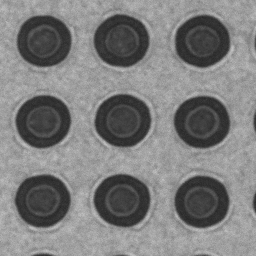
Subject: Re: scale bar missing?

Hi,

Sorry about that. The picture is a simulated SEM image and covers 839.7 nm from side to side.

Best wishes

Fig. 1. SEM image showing a regular array of ring-shaped grooves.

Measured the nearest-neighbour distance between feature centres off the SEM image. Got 0.261 µm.